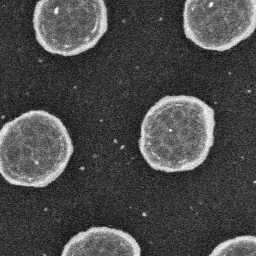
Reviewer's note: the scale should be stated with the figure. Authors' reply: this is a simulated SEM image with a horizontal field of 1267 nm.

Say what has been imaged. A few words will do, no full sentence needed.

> raised bodies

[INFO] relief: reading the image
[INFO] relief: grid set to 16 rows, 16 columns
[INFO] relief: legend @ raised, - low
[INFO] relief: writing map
--@@@@------@@@@
--@@@@@-----@@@@
--@@@@------@@@-
----------------
----------------
----------------
----------@@@---
-@@@-----@@@@---
@@@@-----@@@@---
@@@@-----@@@@---
@@@@------@@----
-@@-------------
----------------
----------------
-----@@---------
----@@@@@-----@@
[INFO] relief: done